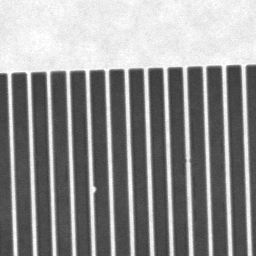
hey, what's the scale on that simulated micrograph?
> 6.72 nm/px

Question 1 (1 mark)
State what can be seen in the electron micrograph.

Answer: parallel lines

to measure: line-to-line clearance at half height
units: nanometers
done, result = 90.6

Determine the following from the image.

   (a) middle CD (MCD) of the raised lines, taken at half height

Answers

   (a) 39.4 nanometres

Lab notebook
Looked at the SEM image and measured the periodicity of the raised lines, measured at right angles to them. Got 131 nanometres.